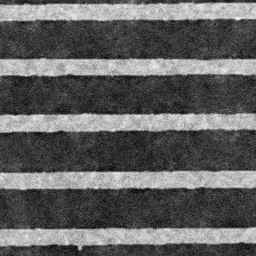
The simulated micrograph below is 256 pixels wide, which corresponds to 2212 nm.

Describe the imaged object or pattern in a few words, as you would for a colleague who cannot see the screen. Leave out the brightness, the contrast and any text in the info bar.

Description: lines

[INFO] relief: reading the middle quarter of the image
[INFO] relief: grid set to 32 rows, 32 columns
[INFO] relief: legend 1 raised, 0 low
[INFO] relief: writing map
11111111111111111111111111111111
11111111111111111111111111111111
10111111111111001111101111100000
00000000000000000000000000000000
00000000000000000000000000000000
00000000000000000000000000000000
00000000000000000000000000000000
00000000000000000000000000000000
00000000000000000000000000000000
00000000000000000000000000000000
00000000000000000000000000000000
00000000000000000000000000000000
00000000000000000000000000000000
11111111111111111111111111111111
11111111111111111111111111111111
11111111111111111111111111111111
11111111111111111011111111000111
00000000000000000000000000000000
00000000000000000000000000000000
00000000000000000000000000000000
00000000000000000000000000000000
00000000000000000000000000000000
00000000000000000000000000000000
00000000000000000000000000000000
00000000000000000000000000000000
00000000000000000000000000000000
00000000000000000000000000000000
11111111111111111111111111111111
11111111111111111111111111111111
11111111111111111111111111111111
11111111111111111111111111111111
00000000000000000000000000000000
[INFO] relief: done